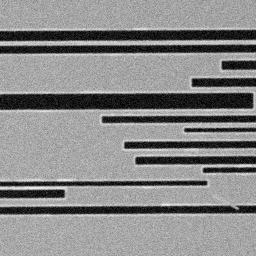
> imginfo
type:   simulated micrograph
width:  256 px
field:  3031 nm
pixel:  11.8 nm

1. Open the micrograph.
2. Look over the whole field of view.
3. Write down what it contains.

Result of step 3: groups of lines, slits or small figures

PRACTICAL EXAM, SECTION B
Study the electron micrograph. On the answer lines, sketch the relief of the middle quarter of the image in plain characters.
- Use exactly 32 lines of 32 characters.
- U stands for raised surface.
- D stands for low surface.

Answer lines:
UUUUUUUUUUUUUUUUUUUUUUUUUUUUUUUU
UUUUUUUUUUUUUUUUUUUUUUUUUUUUUUUU
UUUUUUUUUUUUUUUUUUUUUUUUUUUUUUUU
UUUUUUUUUUUUUUUUUUUUUUUUUUUUUUUU
UUUUUUUUUUUUUUUUUUUUUUUUUUUUUUUU
UUUUUUUUUUUUUUUUUUUUUUUUUUUUUUUU
UUUUUUUUUUUUUUUUUUUUUUUUUUUUUUUU
DDDDDDDDDDDDDDDDDDDDDDDDDDDDDDDD
DDDDDDDDDDDDDDDDDDDDDDDDDDDDDDDD
DDDDDDDDDDDDDDDDDDDDDDDDDDDDDDDD
DDDDDDDDDDDDDDDDDDDDDDDDDDDDDDDD
DDDDDDDDDDDDDDDDDDDDDDUUUUUUUUUU
UUUUUUUUUUUUUUUUUUUUUUUUUUUUUUUU
UUUUUUUUUDDDDDDDDDDDDDDDDDDDDDDD
UUUUUUUUUDDDDDDDDDDDDDDDDDDDDDDD
UUUUUUUUUUUUUUUUUUUUUUUUUUUUUUUU
UUUUUUUUUUUUUUUUUUUUUUUUUUUUUUDD
UUUUUUUUUUUUUUUUUUUUUUUUUUUUUUUU
UUUUUUUUUUUUUUUUUUUUUUUUUUUUUUUU
UUUUUUUUUUUUUUUDDDDDDDDDDDDDDDDD
UUUUUUUUUUUUUUUDDDDDDDDDDDDDDDDD
UUUUUUUUUUUUUUUUDUUUUDDDUUUUUUUU
UUUUUUUUUUUUUUUUUUUUUUUUUUUUUUUU
UUUUUUUUUUUUUUUUUUDDDDDDDDDDDDDD
UUUUUUUUUUUUUUUUUUDDDDDDDDDDDDDD
UUUUUUUUUUUUUUUUUUUUUUUUUUUUUUUU
UUUUUUUUUUUUUUUUUUUUUUUUUUUUUUUU
UUUUUUUUUUUUUUUUUUUUUUUUUUUUUUUU
UUUUUUUUUUUUUUUUUUUUUUUUUUUUUUUU
DDDDDDDDDDDDDDDDDDDDDDDDDDDDDDDD
DDDDDDDDDDDDDDDDDDDDDDDDDDDDDDDD
UUUUUUUUUUUUUUUUUUUUUUUUUUUUUUUU